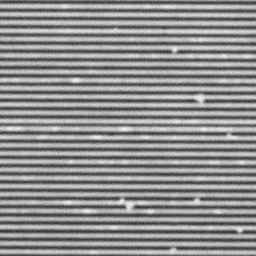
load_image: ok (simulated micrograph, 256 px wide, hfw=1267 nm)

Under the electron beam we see parallel lines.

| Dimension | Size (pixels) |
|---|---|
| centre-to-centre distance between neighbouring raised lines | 8.2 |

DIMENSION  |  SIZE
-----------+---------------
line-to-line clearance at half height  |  17.3 nm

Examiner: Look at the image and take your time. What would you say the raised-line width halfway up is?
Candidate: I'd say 21.1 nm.